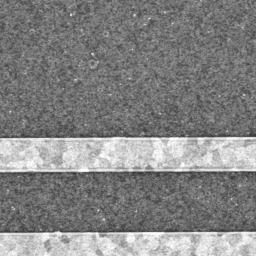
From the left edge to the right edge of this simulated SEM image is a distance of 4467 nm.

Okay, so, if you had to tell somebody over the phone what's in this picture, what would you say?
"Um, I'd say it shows one or a few lines or trenches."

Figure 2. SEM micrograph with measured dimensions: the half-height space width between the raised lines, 1.11 microns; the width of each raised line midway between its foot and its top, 554 nanometers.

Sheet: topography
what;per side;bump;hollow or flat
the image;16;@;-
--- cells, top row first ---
----------------
----------------
----------------
----------------
----------------
----------------
----------------
----------------
----------------
@@@@@@@@@@@@@@@@
@@@@@@@@@@@@@@@@
----------------
----------------
----------------
----------------
@@@@@@@@@@@@@@@@